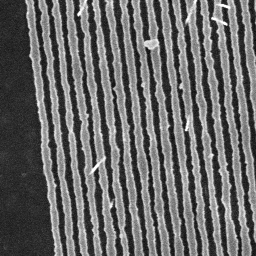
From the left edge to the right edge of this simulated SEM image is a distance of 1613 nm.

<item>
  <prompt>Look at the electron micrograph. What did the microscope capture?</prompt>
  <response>parallel lines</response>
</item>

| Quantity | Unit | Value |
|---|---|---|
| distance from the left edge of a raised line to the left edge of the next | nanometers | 84.1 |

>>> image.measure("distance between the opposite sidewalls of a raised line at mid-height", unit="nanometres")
43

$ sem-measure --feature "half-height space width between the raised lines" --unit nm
43